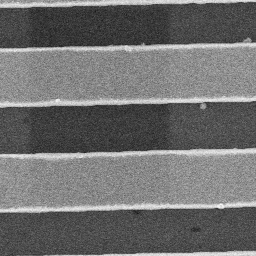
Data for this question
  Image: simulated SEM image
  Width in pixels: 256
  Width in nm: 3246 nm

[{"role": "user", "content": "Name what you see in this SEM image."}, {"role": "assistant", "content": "lines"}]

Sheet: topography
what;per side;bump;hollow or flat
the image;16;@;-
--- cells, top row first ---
----------------
----------------
----------------
@@@@@@@@@@@@@@@@
@@@@@@@@@@@@@@@@
@@@@@@@@@@@@@@@@
@@@@@@@---------
----------------
----------------
--------@@@@@@@@
@@@@@@@@@@@@@@@@
@@@@@@@@@@@@@@@@
@@@@@@@@@@@@@@@@
----------------
----------------
----------------